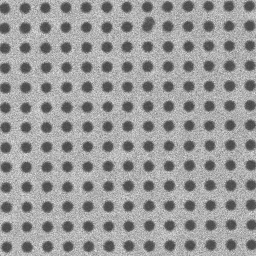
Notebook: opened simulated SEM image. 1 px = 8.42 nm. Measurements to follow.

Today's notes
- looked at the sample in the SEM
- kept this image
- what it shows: a regular array of holes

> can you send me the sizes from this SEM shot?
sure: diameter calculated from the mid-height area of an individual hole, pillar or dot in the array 90.9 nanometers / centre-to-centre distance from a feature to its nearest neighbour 0.166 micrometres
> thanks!